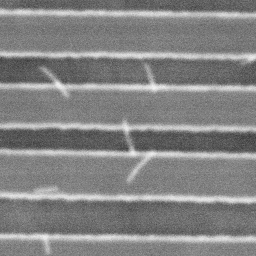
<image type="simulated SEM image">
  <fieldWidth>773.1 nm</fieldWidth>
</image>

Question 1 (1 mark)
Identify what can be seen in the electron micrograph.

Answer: lines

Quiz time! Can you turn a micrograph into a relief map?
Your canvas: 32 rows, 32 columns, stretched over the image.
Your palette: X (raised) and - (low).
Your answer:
--------------------------------
XXXXXXXXXXXXX-------------------
XXXXXXXXXXXXXXXXXXXXXXXXXXXXXXXX
XXXXXXXXXXXXXXXXXXXXXXXXXXXXXXXX
XXXXXXXXXXXXXXXXXXXXXXXXXXXXXXXX
XXXXXXXXXXXXXXXXXXXXXXXXXXXXXXXX
XXXXXXXXXXXXXXXXXXXXXXXXXXXXXXXX
--------------------------------
--------------------------------
--------------------------------
--------------------------------
XXXXXXXXXXXXXXXXXXXXXXXXXXXXXXXX
XXXXXXXXXXXXXXXXXXXXXXXXXXXXXXXX
XXXXXXXXXXXXXXXXXXXXXXXXXXXXXXXX
XXXXXXXXXXXXXXXXXXXXXXXXXXXXXXXX
XXXXXXXXXXXXXXXXXXXXXXXXXXXXXXXX
--------------------------------
--------------------------------
--------------------------------
XXXXXXXXXXXXXXXXXXXXXXXXXXXXXXXX
XXXXXXXXXXXXXXXXXXXXXXXXXXXXXXXX
XXXXXXXXXXXXXXXXXXXXXXXXXXXXXXXX
XXXXXXXXXXXXXXXXXXXXXXXXXXXXXXXX
XXXXXXXXXXXXXXXXXXXXXXXXXXXXXXXX
XXXXXXXXXXXXXXXXXXXXXXXXXXXXXXXX
--------------------------------
--------------------------------
--------------------------------
--------------------------------
XXXXXX-X------------------------
XXXXXXXXXXXXXXXXXXXXXXXXXXXXXXXX
XXXXXXXXXXXXXXXXXXXXXXXXXXXXXXXX